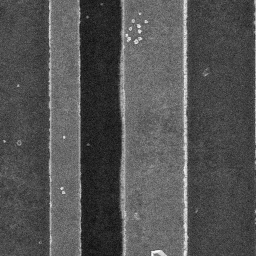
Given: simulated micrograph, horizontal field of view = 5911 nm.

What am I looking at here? lines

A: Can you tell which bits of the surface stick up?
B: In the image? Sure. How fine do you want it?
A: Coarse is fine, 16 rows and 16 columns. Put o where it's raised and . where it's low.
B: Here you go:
...oo...oooo....
...oo...oooo....
...oo...oooo....
...oo...oooo....
...oo...oooo....
...oo...oooo....
...oo...oooo....
...oo...oooo....
...oo...oooo....
...oo...oooo....
...oo...oooo....
...oo...oooo....
...oo...oooo....
...oo...oooo....
...oo...oooo....
...oo...oooo....